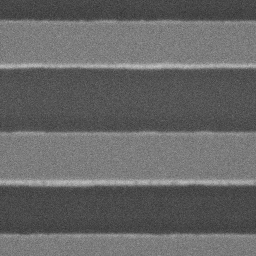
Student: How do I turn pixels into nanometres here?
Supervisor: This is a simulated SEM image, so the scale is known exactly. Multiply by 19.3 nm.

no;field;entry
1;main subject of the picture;lines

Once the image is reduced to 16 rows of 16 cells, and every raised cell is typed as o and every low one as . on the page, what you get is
................
oooooooooooooooo
oooooooooooooooo
oooooooooooooooo
................
................
................
................
oooooooooooooooo
oooooooooooooooo
oooooooooooooooo
................
................
................
................
oooooooooooooooo